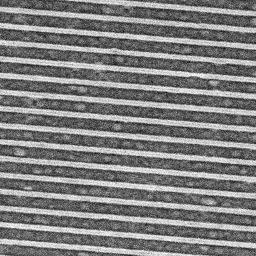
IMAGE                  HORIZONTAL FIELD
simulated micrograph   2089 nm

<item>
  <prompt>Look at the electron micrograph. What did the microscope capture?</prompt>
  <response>parallel lines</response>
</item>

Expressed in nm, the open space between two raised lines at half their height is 104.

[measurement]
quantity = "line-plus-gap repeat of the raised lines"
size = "135 nanometers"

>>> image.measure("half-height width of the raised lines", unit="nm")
34.5